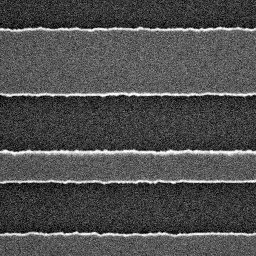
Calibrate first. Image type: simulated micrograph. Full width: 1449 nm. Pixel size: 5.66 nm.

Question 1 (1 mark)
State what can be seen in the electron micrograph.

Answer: lines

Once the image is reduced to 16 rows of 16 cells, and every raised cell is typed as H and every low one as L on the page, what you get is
LLLLLLLLLLLLLLLL
LLLLLLLLLLLLLLLL
HHHHHHHHHHHHHHHH
HHHHHHHHHHHHHHHH
HHHHHHHHHHHHHHHH
HHHHHHHHHHHHHHHH
LLLLLLLLLLLLLLLL
LLLLLLLLLLLLLLLL
LLLLLLLLLLLLLLLL
HHHHHHHHHHHHHHHH
HHHHHHHHHHHHHHHH
LLLLLLLLLLLLLLLL
LLLLLLLLLLLLLLLL
LLLLLLLLLLLLLLLL
LLLLLLLLLLLLLLLL
HHHHHHHHHHHHHHHH